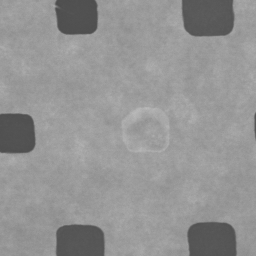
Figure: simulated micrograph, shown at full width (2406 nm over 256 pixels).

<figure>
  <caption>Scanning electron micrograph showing holes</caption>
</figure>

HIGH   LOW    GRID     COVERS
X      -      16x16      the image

XXX---XXXXX----X
XXXX--XXXXXX---X
XXXXXXXXXXXXXXXX
XXXXXXXXXXXXXXXX
XXXXXXXXXXXXXXXX
XXXXXXXXXXXXXXXX
XXXXXXXXXXXXXXXX
--XXXXXXXXXXXXXX
--XXXXXXXXXXXXXX
--XXXXXXXXXXXXXX
XXXXXXXXXXXXXXXX
XXXXXXXXXXXXXXXX
XXXXXXXXXXXXXXXX
XXXXXXXXXXXXXXXX
XXXX--XXXXXX---X
XXXX---XXXXX---X